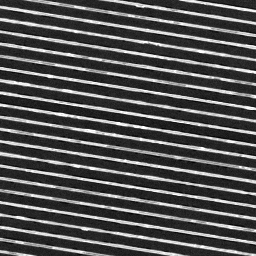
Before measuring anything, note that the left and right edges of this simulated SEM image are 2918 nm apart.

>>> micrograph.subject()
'parallel lines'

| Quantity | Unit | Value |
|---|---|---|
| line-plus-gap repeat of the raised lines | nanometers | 138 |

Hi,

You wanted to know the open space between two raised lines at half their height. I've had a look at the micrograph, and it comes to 0.104 µm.